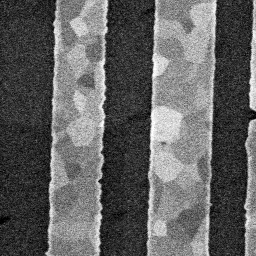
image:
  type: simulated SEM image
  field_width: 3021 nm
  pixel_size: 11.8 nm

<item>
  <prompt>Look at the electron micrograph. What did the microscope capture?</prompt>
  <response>one or a few lines or trenches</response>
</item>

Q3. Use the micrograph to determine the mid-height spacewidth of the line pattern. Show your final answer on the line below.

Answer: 546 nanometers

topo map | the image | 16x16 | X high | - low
----XXX---XXX---
---XXXX---XXX---
---XXXX---XXX---
---XXXX---XXX---
---XXX----XXX---
---XXXX---XXX---
---XXX----XXX---
---XXX---XXXX---
---XXX---XXXX---
---XXX---XXXX--X
---XXX---XXXX---
---XXX---XXXX--X
---XXX---XXXX--X
---XXX---XXXX--X
---XXX---XXXX--X
---XXX---XXXX--X